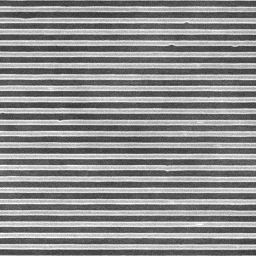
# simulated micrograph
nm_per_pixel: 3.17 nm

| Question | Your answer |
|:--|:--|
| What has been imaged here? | parallel lines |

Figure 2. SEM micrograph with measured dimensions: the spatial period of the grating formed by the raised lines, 35.9 nanometres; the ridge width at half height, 13.5 nanometres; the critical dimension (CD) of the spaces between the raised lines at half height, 0.0214 microns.